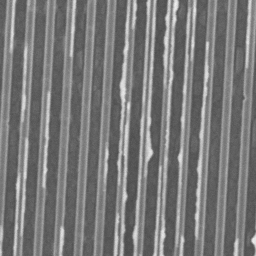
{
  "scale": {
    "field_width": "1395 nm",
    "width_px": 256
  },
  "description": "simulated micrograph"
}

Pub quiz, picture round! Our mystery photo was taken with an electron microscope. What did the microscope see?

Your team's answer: parallel lines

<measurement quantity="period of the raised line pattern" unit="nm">110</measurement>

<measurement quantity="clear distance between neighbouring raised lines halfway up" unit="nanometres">64.6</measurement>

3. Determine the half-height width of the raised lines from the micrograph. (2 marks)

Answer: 45.6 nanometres